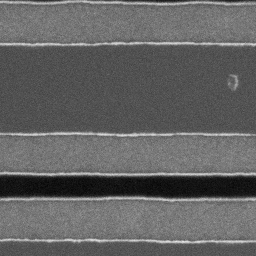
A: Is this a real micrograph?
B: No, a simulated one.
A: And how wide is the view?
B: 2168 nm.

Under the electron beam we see lines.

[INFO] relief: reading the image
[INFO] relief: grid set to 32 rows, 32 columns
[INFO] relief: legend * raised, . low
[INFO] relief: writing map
................................
................................
................................
................................
................................
*******..**.********************
********************************
********************************
********************************
********************************
********************************
********************************
********************************
********************************
********************************
********************************
********************************
................................
................................
................................
................................
................................
********************************
********************************
********************************
................................
................................
................................
................................
................................
********************************
********************************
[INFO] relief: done